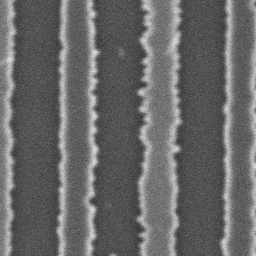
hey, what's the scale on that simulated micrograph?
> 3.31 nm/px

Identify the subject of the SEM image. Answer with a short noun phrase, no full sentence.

lines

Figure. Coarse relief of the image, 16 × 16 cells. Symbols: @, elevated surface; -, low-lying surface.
@---@@---@@---@@
@---@@---@@---@@
@---@@---@@---@@
@---@@---@@---@@
@---@@---@@---@@
@---@@---@@---@@
@---@@---@@---@@
@---@@---@@---@@
@---@@---@@---@@
@---@@---@@---@@
@---@@---@@---@@
@---@@---@@---@@
@---@@---@@---@@
@---@@---@@---@@
@---@@---@@---@@
@---@@---@@---@@